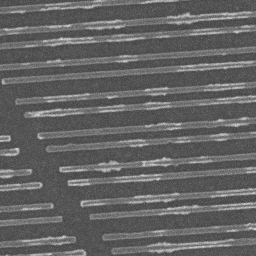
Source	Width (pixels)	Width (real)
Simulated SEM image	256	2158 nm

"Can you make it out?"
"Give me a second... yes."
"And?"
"parallel lines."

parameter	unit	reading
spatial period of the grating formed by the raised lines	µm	0.147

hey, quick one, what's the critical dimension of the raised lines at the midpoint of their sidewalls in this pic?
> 5.61 px